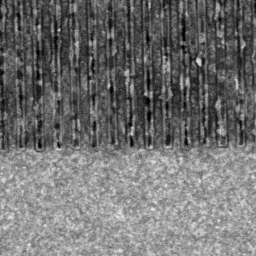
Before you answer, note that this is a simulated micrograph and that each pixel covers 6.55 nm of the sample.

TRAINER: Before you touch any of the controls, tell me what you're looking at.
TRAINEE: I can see parallel lines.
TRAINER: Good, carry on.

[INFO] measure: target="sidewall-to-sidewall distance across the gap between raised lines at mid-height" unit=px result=10.9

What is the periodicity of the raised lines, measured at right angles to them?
0.12 micrometres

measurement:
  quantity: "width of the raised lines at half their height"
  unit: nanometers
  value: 47.5